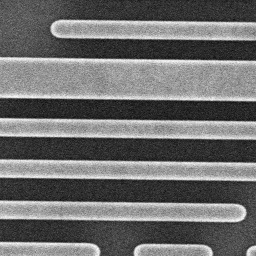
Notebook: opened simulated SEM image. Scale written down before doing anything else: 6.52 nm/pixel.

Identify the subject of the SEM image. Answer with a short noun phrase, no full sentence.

groups of lines, slits or small figures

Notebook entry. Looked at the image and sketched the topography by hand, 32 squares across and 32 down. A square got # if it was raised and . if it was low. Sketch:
................................
................................
................................
......##########################
.......#########################
................................
................................
#################...............
################################
################################
################################
################################
........................########
................................
................................
################################
################################
................................
................................
................................
################################
################################
.........................#######
................................
................................
##############################..
###############################.
................##############..
................................
................................
###########.....................
############.....#########.....#